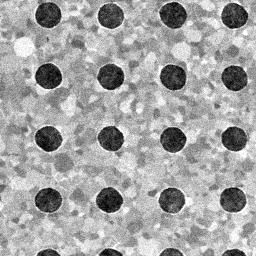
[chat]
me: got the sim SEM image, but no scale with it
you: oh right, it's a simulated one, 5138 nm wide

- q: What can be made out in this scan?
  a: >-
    a regular array of holes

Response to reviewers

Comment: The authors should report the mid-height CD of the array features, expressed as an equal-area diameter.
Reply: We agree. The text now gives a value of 546 nm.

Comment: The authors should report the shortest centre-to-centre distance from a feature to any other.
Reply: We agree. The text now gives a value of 1220 nanometres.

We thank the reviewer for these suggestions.